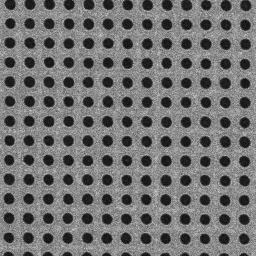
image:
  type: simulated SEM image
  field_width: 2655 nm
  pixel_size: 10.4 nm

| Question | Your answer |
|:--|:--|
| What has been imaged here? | a regular array of holes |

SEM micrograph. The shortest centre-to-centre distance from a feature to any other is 199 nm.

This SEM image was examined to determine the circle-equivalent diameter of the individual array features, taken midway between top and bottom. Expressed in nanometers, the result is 113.